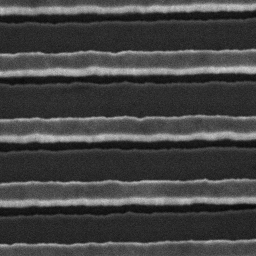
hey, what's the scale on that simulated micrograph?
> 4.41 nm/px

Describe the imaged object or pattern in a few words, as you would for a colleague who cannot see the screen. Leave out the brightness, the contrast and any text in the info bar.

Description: lines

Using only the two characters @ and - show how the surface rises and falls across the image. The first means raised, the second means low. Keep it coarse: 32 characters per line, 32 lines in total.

@@@@@@@@@@@@@@@@@@@@@@@@@@@@@@@@
@@@@@@@@@-----------------------
--------------------------------
--------------------------------
--------------------------------
--------------------------------
----------@@@--@@@-@@@@@@@@@@@@@
@@@@@@@@@@@@@@@@@@@@@@@@@@@@@@@@
@@@@@@@@@@@@@@@@@@@@@@@@@@@@@@@@
--------------------------------
--------------------------------
--------------------------------
--------------------------------
--------------------------------
-----------------------@@@------
@@@@@@@@@@@@@@@@@@@@@@@@@@@@@@@@
@@@@@@@@@@@@@@@@@@@@@@@@@@@@@@@@
@@@@@@@@@@@@@-----@-------------
--------------------------------
--------------------------------
--------------------------------
--------------------------------
-------------------------@--@@@@
@@@@@@@@@@@@@@@@@@@@@@@@@@@@@@@@
@@@@@@@@@@@@@@@@@@@@@@@@@@@@@@@@
@@@@@@@@@@@@@@@-----------------
--------------------------------
--------------------------------
--------------------------------
--------------------------------
--@@@@@--@@@@@@@@@@@@@@@@@@@@@@@
@@@@@@@@@@@@@@@@@@@@@@@@@@@@@@@@